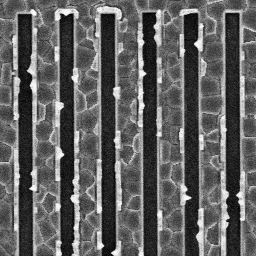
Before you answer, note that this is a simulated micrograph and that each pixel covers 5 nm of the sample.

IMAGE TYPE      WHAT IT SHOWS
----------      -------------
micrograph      parallel lines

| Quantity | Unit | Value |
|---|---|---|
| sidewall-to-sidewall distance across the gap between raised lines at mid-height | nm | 77.5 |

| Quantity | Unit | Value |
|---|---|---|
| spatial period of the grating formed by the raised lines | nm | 208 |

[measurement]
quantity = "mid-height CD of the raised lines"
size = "26.6 pixels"